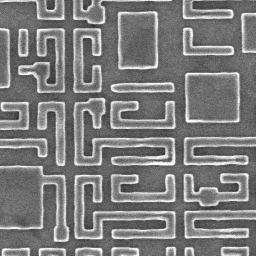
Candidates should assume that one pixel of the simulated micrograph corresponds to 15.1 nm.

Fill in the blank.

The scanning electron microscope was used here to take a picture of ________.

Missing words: wiring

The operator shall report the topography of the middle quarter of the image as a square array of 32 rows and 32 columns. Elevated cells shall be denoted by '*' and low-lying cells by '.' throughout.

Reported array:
..***..**.....*********.........
..***..**.......................
..***..**......................*
...**..**.....................**
...**..**.....................**
..*******...***************...**
..*******...***************...**
..............................**
..............................**
.....*****..******........*....*
...*******..******.......**....*
...**.****..****.........**....*
..***..***..**...........**...**
...**..**...**...........***..**
...**..**...****************....
...**..**...****************....
...**...........................
...**...........................
...**................******...**
...**..********************...**
...**..***.********..******...**
...**..**................***..**
...**..**................***..**
...******...****************..**
...******...****************..**
................................
................................
................................
...******...******.......**...**
...******...******.......***..**
...**..**...**...........***..**
...**..**...**...........***..**